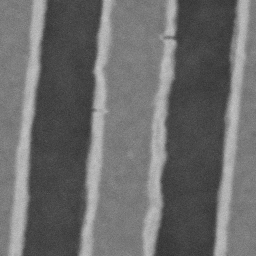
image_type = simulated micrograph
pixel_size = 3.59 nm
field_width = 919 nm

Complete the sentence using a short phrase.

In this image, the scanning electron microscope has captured one or a few lines or trenches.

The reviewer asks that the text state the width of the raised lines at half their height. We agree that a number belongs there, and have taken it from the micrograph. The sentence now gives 223 nm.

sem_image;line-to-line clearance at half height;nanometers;253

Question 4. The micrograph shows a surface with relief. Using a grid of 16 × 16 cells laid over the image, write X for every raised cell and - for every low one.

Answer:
XX-----XXXX----X
XX-----XXXX----X
XX----XXXXX----X
XX----XXXX-----X
XX----XXXX-----X
XX----XXXX-----X
XX----XXXX-----X
XX----XXXX-----X
XX----XXXX----XX
X-----XXXX----XX
X-----XXXX----XX
X-----XXXX----XX
X-----XXXX----XX
X-----XXXX----XX
X----XXXX-----XX
X----XXXX-----XX